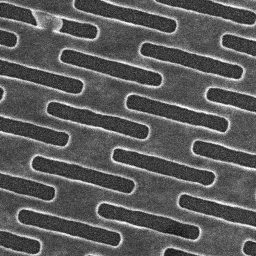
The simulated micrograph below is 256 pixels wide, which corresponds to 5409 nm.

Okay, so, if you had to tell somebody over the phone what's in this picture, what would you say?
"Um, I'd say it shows a regular array of holes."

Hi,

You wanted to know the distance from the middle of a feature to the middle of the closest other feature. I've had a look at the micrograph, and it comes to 1150 nanometres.